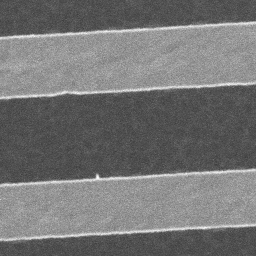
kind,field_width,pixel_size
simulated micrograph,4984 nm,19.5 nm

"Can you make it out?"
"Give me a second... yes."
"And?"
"one or a few lines or trenches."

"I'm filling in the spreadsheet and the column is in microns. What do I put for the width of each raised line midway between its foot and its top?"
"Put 1.13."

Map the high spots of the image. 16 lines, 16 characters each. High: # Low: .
................
............#.##
################
################
################
###########.....
................
................
................
................
................
.###############
################
################
#########....#..
................